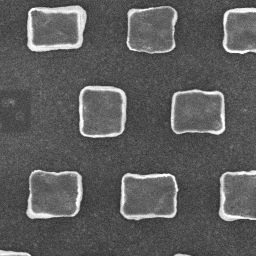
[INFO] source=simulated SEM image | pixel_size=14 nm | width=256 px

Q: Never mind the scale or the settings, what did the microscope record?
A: raised bodies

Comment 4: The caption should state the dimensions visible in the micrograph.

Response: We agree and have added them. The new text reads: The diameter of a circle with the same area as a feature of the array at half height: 730 nm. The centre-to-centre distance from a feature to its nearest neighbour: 1330 nanometres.